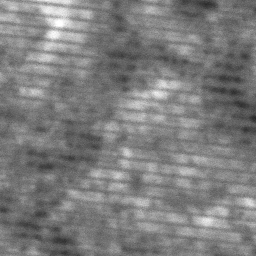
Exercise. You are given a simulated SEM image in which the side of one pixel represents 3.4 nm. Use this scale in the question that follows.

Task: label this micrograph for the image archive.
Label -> parallel lines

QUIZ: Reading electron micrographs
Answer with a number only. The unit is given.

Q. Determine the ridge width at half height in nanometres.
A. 26.2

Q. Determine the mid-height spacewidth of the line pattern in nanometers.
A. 14.8